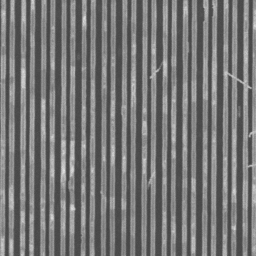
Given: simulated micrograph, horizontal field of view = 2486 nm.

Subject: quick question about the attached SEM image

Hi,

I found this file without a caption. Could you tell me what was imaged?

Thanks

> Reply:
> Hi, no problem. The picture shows parallel lines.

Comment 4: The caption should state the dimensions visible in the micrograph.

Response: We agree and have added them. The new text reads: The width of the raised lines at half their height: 32.8 nm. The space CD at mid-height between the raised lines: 59.5 nm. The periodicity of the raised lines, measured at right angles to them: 98.2 nanometers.